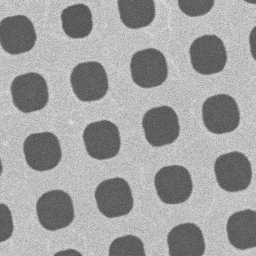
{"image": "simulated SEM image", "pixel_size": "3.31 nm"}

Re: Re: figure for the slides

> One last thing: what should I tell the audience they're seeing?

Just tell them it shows a regular array of holes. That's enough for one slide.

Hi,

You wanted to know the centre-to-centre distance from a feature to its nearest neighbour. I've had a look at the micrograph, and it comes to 198 nanometers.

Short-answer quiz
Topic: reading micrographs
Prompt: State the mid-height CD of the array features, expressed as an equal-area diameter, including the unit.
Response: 0.129 microns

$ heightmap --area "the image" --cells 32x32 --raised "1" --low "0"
11111111111111100001110000011111
11111111000111100001111000111111
00001111000011100001111111111111
00001111000111110111111111111111
00001111100111111111111111011110
00001111111111111111111100001110
10011111111111111000111100001110
11111111111111110000011100001111
11111111100001110000011100001111
11000111100001110000011111111111
10000011100001111000111111111111
10000011100001111111111111111111
11000011110011111111111111000111
11000111111111111110011110000011
11111111111111111100001110000011
11111111111000111100001111000011
11111111110000011100001111000111
11100001110000011100001111111111
11100001111000011111111111111111
11100000111000111111111111110001
11110001111111111111111111100001
11111111111111111111000011100001
11111111111110011110000011100001
11111111111100001110000011110001
11111000011100000111000011111111
11111000011100000111101111111111
01111000011110001111111111111100
00111000011111111111111111111000
00111100111111111111110001110000
01111111111111110111100001110000
11111111111111000011100000111000
11111110001111000011100001111111